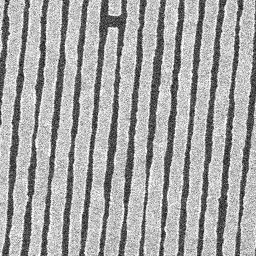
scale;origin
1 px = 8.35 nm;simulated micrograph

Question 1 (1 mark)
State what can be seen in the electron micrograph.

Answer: parallel lines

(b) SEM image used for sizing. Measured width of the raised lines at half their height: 0.108 µm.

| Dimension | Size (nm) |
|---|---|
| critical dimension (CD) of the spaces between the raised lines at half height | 52.5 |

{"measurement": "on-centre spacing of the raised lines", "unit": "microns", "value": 0.161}